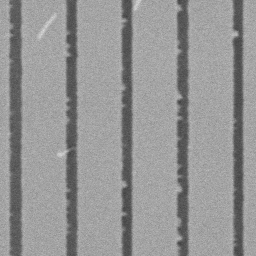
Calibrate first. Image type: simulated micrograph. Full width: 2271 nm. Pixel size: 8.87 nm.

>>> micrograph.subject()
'lines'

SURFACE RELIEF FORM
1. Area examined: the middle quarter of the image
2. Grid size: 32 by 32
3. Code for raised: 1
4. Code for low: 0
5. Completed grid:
00011111111111000111111111110001
00011111111111000111111111110001
00011111111111000111111111110001
10011111111111000111111111110001
00011111111111000111111111110001
00011111111111100111111111110001
00011111111111000111111111110001
10011111111111000111111111111001
10011111111111000111111111111001
10011111111111000111111111110001
00011111111111100111111111110001
10011111111111000111111111110001
00011111111111000111111111110001
00011111111111000111111111111001
10011111111111000111111111110001
00011111111111000111111111110001
00011111111111000111111111110001
00011111111111000111111111110001
00011111111111000111111111110001
00011111111111000111111111110001
10011111111111000111111111110001
10011111111111000111111111110001
10011111111111000111111111110001
10011111111111000111111111110001
00011111111111000111111111110001
00011111111111000111111111111001
00011111111111000111111111110001
00001111111111000111111111110001
00011111111111000111111111111001
00001111111111100111111111110001
10011111111111100111111111111001
10001111111111000111111111111001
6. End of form